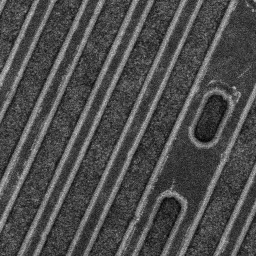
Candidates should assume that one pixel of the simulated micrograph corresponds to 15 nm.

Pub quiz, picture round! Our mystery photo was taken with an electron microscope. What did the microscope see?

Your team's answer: parallel lines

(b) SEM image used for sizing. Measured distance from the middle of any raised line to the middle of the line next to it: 44.5 px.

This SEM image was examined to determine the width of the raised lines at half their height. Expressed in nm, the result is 241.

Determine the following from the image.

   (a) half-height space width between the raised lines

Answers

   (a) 0.443 micrometres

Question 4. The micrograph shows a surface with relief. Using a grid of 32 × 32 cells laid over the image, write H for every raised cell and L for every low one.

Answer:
LLLLHHHLLLHHHLLLLHHLLLLHHLLLLHHH
LLLLHHLLLLHHLLLLHHLLLLHHLLLLLHHH
LLLHHHLLLLHHLLLLHHLLLLHHLLLLHHHH
LLLHHLLLLHHLLLLHHLLLLHHHLLLLHHHH
LLLHHLLLLHHLLLLHHLLLLHHLLLLHHHHH
LLHHLLLLHHLLLLHHHLLLHHHLLLLHHHHH
LLHHLLLLHHLLLLHHLLLLHHLLLLHHHHHH
LHHLLLLHHLLLLLHHLLLLHHLLLLHHHHHH
LHHLLLLHHLLLLHHLLLLHHLLLLHHHHHHH
HHHLLLHHHLLLLHHLLLLHHLLLLHHHHHHH
HHLLLLHHLLLLHHLLLLHHLLLLHHHHHHHH
HHLLLHHHLLLLHHLLLLHHLLLLHHHHHHHH
HLLLLHHLLLLHHLLLLHHHLLLLHHLLHHHL
HLLLHHHLLLLHHLLLLHHLLLLHHLLLLHHL
LLLLHHLLLLHHLLLLHHHLLLLHHLLLHHHL
LLLLHHLLLLHHLLLLHHLLLLHHLLLLHHLL
LLLHHLLLLHHHLLLLHHLLLLHHLLLHHHLL
LLLHHLLLLHHLLLLHHLLLLHHHLLLHHLLL
LLHHHLLLLHHLLLLHHLLLLHHHHHHHHLLL
LLHHLLLLHHLLLLHHLLLLHHHHHHHHLLLL
LHHHLLLLHHLLLLHHLLLLHHHHHHHHLLLL
LHHLLLLHHLLLLHHLLLLHHHHHHHHLLLLL
HHHLLLLHHLLLLHHLLLLHHHHHHHHLLLLH
HHLLLLHHLLLLHHHLLLHHHHHHHHLLLLLH
HHLLLLHHLLLLHHLLLLHHHLHHHHLLLLHH
HLLLLHHLLLLHHHLLLLHHLLLHHHLLLLHH
HLLLLHHLLLLHHLLLLHHLLLLHHLLLLHHH
LLLLLHHLLLLHHLLLLHHLLLHHHLLLLHHL
LLLLHHLLLLHHLLLLHHHLLLHHLLLLLHHL
LLLLHHLLLLHHLLLLHHLLLHHHLLLLHHLL
LLLHHLLLLHHLLLLHHHLLLHHLLLLLHHLL
LLLHHLLLLHHLLLLHHLLLLHHLLLLHHLLL